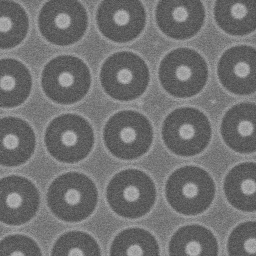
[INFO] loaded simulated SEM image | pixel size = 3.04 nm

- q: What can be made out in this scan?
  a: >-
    an array of small figures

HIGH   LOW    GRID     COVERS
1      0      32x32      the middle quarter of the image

00000011100000000000011100000000
00000011100000010000011100001110
10000001100000111000001000001111
11000001100001111000001000000110
11000001100000110000011100000000
10000001100000000000011100000000
00000011110000000000011110000000
00000011110000000000111111000000
00000111111100000001111111110001
00001111111111101111111111111111
11111111111111111111111111111111
11111111111111000111111111100000
00011111111110000000111111000000
00000111111000000000011110000000
00000011110000000000001110000000
00000001110000000000001100000011
00000001110000011000001100000111
11100000110000111100001100000111
11100000110000111100001100000010
11100000110000011000001110000000
00000001110000000000001110000000
00000001111000000000011111000000
00000011111100000000111111100000
00000111111110000001111111111111
00001111111111111111111111111111
11111111111111111111111111111100
11111111111111100001111111110000
00000111111110000000011111100000
00000011111100000000001111000000
00000000111000000000001110000000
00000000111000000000000110000011
00000000110000011100000110000011